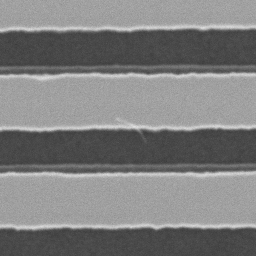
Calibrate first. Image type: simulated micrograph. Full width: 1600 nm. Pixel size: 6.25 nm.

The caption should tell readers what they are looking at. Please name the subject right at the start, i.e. lines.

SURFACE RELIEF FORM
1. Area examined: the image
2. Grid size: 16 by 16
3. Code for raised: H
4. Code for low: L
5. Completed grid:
HHHHHHHHHHHHHHHH
HHHHHHHHHHHHHHHH
LLLLLLLLLLLLLLLL
LLLLLLLLLLLLLLLL
LLLLLLLLLLLLLLLL
HHHHHHHHHHHHHHHH
HHHHHHHHHHHHHHHH
HHHHHHHHHHHHHHHH
LLLLLLLLLLLLLLLL
LLLLLLLLLLLLLLLL
LLLLLLLLLLLLLLLL
HHHHHHHHHHHHHHHH
HHHHHHHHHHHHHHHH
HHHHHHHHHHHHHHHH
LLLLLLLLLLLLLLLL
LLLLLLLLLLLLLLLL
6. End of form